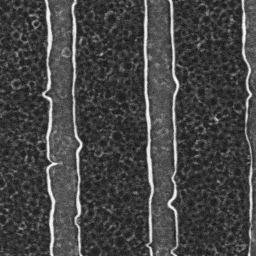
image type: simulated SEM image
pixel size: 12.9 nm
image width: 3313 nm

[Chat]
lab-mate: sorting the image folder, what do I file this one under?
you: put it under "one or a few lines or trenches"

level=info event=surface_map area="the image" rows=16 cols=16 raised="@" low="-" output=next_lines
@@@--@@@@--@@@@-
@@@--@@@@--@@@@-
@@@--@@@@--@@@@-
@@@--@@@@--@@@@-
@@@--@@@@--@@@@@
@@@--@@@@--@@@@@
@@@--@@@@--@@@@-
@@@--@@@@--@@@@-
@@@--@@@@--@@@@-
@@@--@@@@--@@@@@
@@@--@@@@--@@@@@
@@@--@@@@--@@@@@
@@@--@@@@--@@@@@
@@@--@@@@--@@@@@
@@@--@@@@--@@@@@
@@@--@@@@--@@@@@